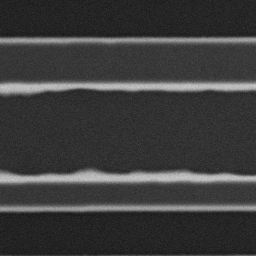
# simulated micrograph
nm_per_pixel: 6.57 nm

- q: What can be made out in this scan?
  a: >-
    lines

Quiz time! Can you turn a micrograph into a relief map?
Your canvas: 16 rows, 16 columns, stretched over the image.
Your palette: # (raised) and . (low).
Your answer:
................
................
................
################
################
................
................
................
................
................
................
################
################
................
................
................